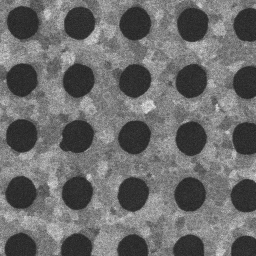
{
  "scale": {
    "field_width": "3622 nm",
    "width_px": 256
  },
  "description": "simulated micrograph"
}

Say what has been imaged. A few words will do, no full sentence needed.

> a regular array of holes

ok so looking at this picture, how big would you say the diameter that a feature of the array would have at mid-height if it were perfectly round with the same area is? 462 nanometers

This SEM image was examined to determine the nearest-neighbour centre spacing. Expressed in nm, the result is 792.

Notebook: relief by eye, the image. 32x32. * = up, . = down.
********************************
*...*****..*****..*****..*****..
*....***....***....***....***...
*....***....***....***....***...
**..*****..*****..*****...****..
********************************
********************************
********************************
*...*****..*****..*****..*****..
*....***....***....***....***...
*....***....***....***....***...
*...****...****...****...****...
********************************
********************************
********************************
*...****...*****..*****..*****..
*....***....***....***....***...
*....***....***....***....***...
*...****...****...****....***...
********************************
********************************
********************************
*...*****..*****..*****..*****.*
*...****....***...****....***...
*...****....***....***....***...
*...****...****...****...****...
******************************.*
********************************
********************************
*...*****..*****.******.******.*
*...****...****...****...****...
*...****...****....***...****...